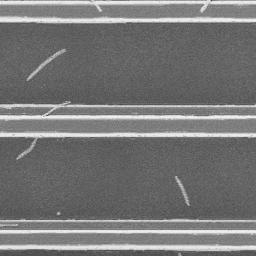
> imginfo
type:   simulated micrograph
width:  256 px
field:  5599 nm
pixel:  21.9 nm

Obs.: lines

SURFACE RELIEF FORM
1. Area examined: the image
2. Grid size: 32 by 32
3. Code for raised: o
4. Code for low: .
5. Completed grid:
oooooooooooooooooooooooooooooooo
oooooooooooooooooooooooooooooooo
oooooooooooooooooooooooooooooooo
................................
................................
................................
................................
................................
................................
................................
................................
................................
................................
oooooooooooooooooooooooooooooooo
oooooooooooooooooooooooooooooooo
oooooooooooooooooooooooooooooooo
oooooooooooooooooooooooooooooooo
................................
................................
................................
................................
................................
................................
................................
................................
................................
................................
................................
oooooooooooooooooooooooooooooooo
oooooooooooooooooooooooooooooooo
oooooooooooooooooooooooooooooooo
................................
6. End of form